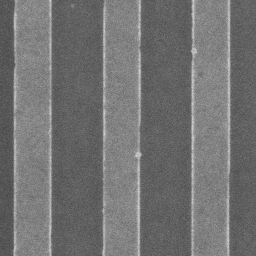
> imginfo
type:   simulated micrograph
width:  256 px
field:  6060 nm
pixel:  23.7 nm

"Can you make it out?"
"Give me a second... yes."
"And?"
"lines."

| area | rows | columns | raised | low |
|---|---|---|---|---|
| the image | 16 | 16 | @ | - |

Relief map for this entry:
-@@----@@---@@--
-@@----@@---@@--
-@@----@@---@@--
-@@----@@---@@--
-@@----@@---@@--
-@@----@@---@@--
-@@----@@---@@--
-@@----@@---@@--
-@@----@@---@@--
-@@----@@---@@--
-@@----@@---@@--
-@@----@@---@@--
-@@----@@---@@--
-@@---@@@---@@--
-@@----@@---@@--
-@@---@@@---@@--